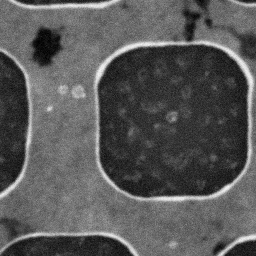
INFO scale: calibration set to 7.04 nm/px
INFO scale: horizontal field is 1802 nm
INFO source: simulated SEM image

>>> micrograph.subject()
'holes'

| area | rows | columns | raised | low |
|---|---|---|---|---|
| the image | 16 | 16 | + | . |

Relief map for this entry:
++++++++++++++++
++++++++++++++++
++++++++++++++++
.++++++........+
.+++++.........+
..++++..........
..++++..........
..++++..........
..++++..........
..++++.........+
.+++++.........+
.++++++.......++
++++++++++++++++
++++++++++++++++
++++++++++++++++
........++++++..